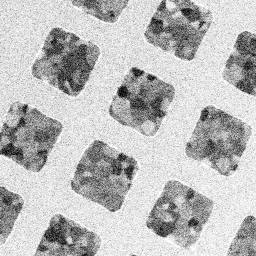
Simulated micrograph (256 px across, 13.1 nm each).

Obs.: raised bodies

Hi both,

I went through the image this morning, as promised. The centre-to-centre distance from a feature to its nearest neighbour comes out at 1100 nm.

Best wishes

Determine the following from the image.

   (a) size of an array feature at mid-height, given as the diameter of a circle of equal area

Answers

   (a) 834 nanometres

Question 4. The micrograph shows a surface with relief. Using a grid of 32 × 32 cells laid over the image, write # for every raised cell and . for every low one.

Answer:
.........#######....#####.......
..........#####....#######......
............###....########.....
.......#..........########......
......####........########....##
.....#######.......######....###
.....########........####....###
....########...........#....####
....########....#...........####
....#######.....####........####
......#####....######........###
........##....########........##
..............########..........
.###..........#######....##.....
.#####........#######....####...
########.......#####....#######.
########.........###....########
#######.................#######.
#######....###.........########.
######....######.......#######..
..####....#######........#####..
....#....########..........##...
.........########....#..........
#........#######....####........
###.......######....######......
###.........###....########.....
###................########.....
##....###.........########....##
##....#####.......########....##
#....#######........#####....###
.....########.........###....###
....########................####